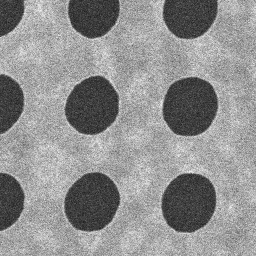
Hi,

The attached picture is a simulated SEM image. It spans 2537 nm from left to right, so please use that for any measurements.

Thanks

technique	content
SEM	holes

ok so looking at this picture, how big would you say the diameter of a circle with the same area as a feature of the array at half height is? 570 nanometers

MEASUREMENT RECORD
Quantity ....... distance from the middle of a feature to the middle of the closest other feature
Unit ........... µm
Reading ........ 0.955